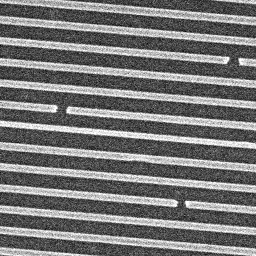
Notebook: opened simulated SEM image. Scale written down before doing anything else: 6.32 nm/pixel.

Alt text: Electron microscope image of parallel lines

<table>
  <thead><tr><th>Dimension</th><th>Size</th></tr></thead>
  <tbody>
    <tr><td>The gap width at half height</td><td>90.4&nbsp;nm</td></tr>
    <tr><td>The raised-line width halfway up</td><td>42.5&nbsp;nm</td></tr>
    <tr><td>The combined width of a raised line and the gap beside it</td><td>132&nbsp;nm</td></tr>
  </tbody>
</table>